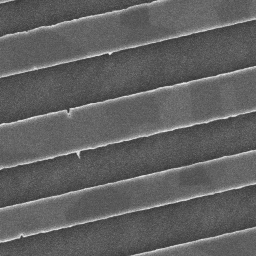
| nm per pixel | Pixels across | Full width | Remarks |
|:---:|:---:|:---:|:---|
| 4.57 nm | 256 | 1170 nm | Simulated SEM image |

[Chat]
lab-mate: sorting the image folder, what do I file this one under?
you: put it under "one or a few lines or trenches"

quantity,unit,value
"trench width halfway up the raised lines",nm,192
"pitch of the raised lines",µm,0.364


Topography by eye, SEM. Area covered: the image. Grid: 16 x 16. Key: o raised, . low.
........oooooooo
....ooooooooooo.
oooooooooo......
oooooo..........
oo.............o
..........oooooo
......oooooooooo
.oooooooooooo...
ooooooooo.......
ooooo..........o
...........ooooo
.......ooooooooo
..oooooooooo....
ooooooo.........
ooo............o
..........oooooo